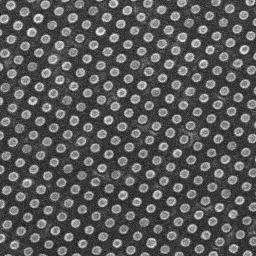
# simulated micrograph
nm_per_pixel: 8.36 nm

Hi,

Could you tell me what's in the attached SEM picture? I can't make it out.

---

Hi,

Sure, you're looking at a regular array of raised bodies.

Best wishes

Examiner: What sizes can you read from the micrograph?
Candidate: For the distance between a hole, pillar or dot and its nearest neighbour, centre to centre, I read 15.2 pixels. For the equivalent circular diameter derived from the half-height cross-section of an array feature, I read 71.2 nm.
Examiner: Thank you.